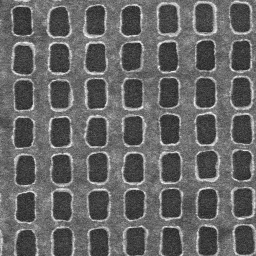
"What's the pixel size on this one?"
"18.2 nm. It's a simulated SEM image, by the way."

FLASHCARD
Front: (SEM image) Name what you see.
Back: a regular array of holes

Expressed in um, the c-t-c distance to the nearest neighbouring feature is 0.649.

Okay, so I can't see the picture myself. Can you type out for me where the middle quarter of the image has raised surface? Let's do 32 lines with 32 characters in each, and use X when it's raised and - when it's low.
--XXX------XXX-----XXXXX----XXXX
-XXXXX-----XXXX----XXXXX----XXXX
XXXXXXXXXXXXXXXXXXXXXXXXXXXXXXXX
XXXXXXXXXXXXXXXXXXXXXXXXX--XXXXX
-XXXXX----XXXXX----XXXXX----XXXX
-XXXXX-----XXXX-----XXXX-----XXX
--XXXX-----XXXX-----XXXX-----XXX
--XXXX-----XXXX-----XXXX-----XXX
--XXXX-----XXXX-----XXXX-----XXX
--XXXX-----XXXX-----XXXX-----XXX
-XXXXX----XXXXX----XXXXX----XXXX
XXXXXXXXXXXXXXXXXXXXXXXXXXXXXXXX
XXXXXXXXXXXXXXXXXXXXXXXXXXXXXXXX
-XXXXXX---XXXXX----XXXXX-----XXX
--XXXX-----XXXX-----XXXX-----XXX
--XXXX-----XXXX-----XXXX-----XXX
--XXXX-----XXXX-----XXXX-----XXX
--XXX------XXXX-----XXXX-----XXX
--XXX------XXXX-----XXXX-----XXX
--XXXX-----XXXX-----XXXXX---XXXX
-XXXXX----XXXXXXXXXXXXXXXXXXXXXX
XXXXXXXXXXXXXXXXXXXXXXXXXXXXXXXX
XXXXXXX---XXXXXXX--XXXXXX----XXX
-XXXXX-----XXXX-----XXXX-----XXX
--XXXX-----XXXX-----XXXX-----XXX
--XXXX-----XXXX-----XXXX-----XXX
--XXXX-----XXXX-----XXXX-----XXX
--XXXX-----XXXX-----XXXX-----XXX
--XXXX-----XXXX-----XXXX-----XXX
--XXXXX---XXXXXX---XXXXXX---XXXX
XXXXXXXXXXXXXXXXXXXXXXXXXXXXXXXX
XXXXXXXX-XXXXXXX---XXXXXX----XXX